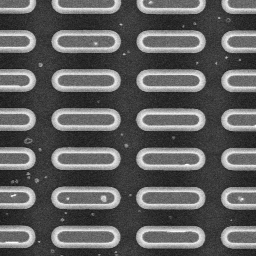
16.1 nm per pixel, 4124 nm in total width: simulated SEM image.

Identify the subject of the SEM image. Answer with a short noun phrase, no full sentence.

groups of lines, slits or small figures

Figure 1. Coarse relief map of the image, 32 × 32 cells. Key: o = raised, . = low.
oooo...oooooooo..oooooooo...oooo
................................
................................
................................
oooo...ooooooo....ooooooo...oooo
oooo...oooooooo..oooooooo...oooo
................................
................................
................................
oooo...ooooooo....ooooooo...oooo
oooo...oooooooo..oooooooo...oooo
................................
................................
................................
oooo...ooooooo....ooooooo...oooo
oooo...ooooooo....ooooooo...oooo
................................
................................
................................
oooo...oooooooo..oooooooo...oooo
oooo...ooooooo....ooooooo...oooo
................................
................................
................................
oooo...oooooooo..oooooooo...oooo
oooo...ooooooo....ooooooo...oooo
................................
................................
................................
oooo...oooooooo..oooooooo...oooo
oooo...ooooooo....ooooooo...oooo
................................